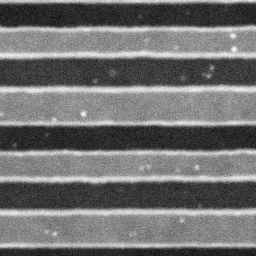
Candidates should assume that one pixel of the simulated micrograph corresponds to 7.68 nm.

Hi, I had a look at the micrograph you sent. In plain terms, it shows lines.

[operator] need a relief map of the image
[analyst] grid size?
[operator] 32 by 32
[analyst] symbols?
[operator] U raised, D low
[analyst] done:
DDDDDDDDDDDDDDDDDDDDDDDDDDDDDDDD
DDDDDDDDDDDDDDDDDDDDDDDDDDDDDDDD
DDDDDDDDDDDDDDDDDDDDDDDDDDDDDDDD
DDDDDDDDDDDDDDDDDDDDDDDDDDDDDDDD
UUUUUUUUUUUUUUUUUUUUUUUUUUUUUUUU
UUUUUUUUUUUUUUUUUUUUUUUUUUUUUUUU
UUUUUUUUUUUUUUUUUUUUUUUUUUUUUUUU
DDDDDDDDDDDDDDDDDDDDDDDDDDDDDDDD
DDDDDDDDDDDDDDDDDDDDDDDDDDDDDDDD
DDDDDDDDDDDDDDDDDDDDDDDDDDDDDDDD
DDDDDDDDDDDDDDDDDDDDDDDDDDDDDDDD
UUUUUUUUUUUUUUUUUUUUUUUUUUUUUUUU
UUUUUUUUUUUUUUUUUUUUUUUUUUUUUUUU
UUUUUUUUUUUUUUUUUUUUUUUUUUUUUUUU
UUUUUUUUUUUUUUUUUUUUUUUUUUUUUUUU
DDDDDDDDDDDDDDDDDDDDDDDDDDDDDDDD
DDDDDDDDDDDDDDDDDDDDDDDDDDDDDDDD
DDDDDDDDDDDDDDDDDDDDDDDDDDDDDDDD
DDDDDDDDDDDDDDDDDDDDDDDDDDDDDDDD
UUUUUUUUUUUUUUUUUUUUUUUUUUUUUUUU
UUUUUUUUUUUUUUUUUUUUUUUUUUUUUUUU
UUUUUUUUUUUUUUUUUUUUUUUUUUUUUUUU
DDDDDDDDDDDDDDDDDDDDDDDDDDDDDDDD
DDDDDDDDDDDDDDDDDDDDDDDDDDDDDDDD
DDDDDDDDDDDDDDDDDDDDDDDDDDDDDDDD
DDDDDDDDDDDDDDDDDDDDDDDDDDDDDDDD
DDDDDDDDDDDDDDDDDDDDDDDDDDDDDDDD
UUUUUUUUUUUUUUUUUUUUUUUUUUUUUUUU
UUUUUUUUUUUUUUUUUUUUUUUUUUUUUUUU
UUUUUUUUUUUUUUUUUUUUUUUUUUUUUUUU
UUUUUUUUUUUUUUUUUUUUUUUUUUUUUUUU
DDDDDDDDDDDDDDDDDDDDDDDDDDDDDDDD